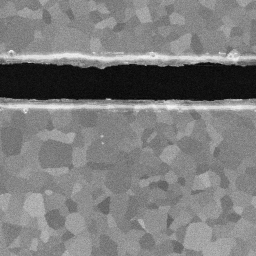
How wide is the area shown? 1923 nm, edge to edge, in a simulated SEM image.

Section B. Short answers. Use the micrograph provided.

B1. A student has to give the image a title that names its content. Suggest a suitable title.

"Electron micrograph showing one or a few lines or trenches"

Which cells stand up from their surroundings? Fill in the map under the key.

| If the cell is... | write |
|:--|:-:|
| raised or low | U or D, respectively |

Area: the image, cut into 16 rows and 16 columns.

UUUUUUUUUUUUUUUU
UUUUUUUUUUUUUUUU
UUUUUUUUUUUUUUUU
UUUUDUUUUUUUUUUU
DDDDDDDDDDDDDDDD
DDDDDDDDDDDDDDDD
DDDDDDDDDDDDDDDD
UUUUUUUUUUUUUUUU
UUUUUUUUUUUUUUUU
UUUUUUUUUUUUUUUU
UUUUUUUUUUUUUUUU
UUUUUUUUUUUUUUUU
UUUUUUUUUUUUUUUU
UUUUUUUUUUUUUUUU
UUUUUUUUUUUUUUUU
UUUUUUUUUUUUUUUU